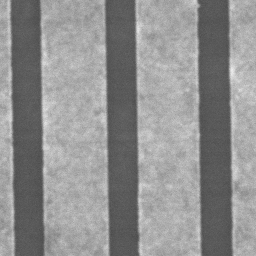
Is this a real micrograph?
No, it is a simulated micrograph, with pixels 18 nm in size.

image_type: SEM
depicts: one or a few lines or trenches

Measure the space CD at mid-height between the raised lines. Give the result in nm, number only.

584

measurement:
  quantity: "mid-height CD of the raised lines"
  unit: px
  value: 61.6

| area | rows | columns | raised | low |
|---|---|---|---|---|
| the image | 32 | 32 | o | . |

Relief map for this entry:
o....oooooooo....oooooooo....ooo
o....oooooooo....ooooooo.....ooo
o....oooooooo....ooooooo.....ooo
o....oooooooo....oooooooo....ooo
o....oooooooo....oooooooo....ooo
o....oooooooo....oooooooo....ooo
o....oooooooo....oooooooo....ooo
o....oooooooo....oooooooo....ooo
o....oooooooo....oooooooo....ooo
o....oooooooo....oooooooo....ooo
o....oooooooo....oooooooo....ooo
o....oooooooo....oooooooo....ooo
o....oooooooo....oooooooo....ooo
o....oooooooo....oooooooo....ooo
o....oooooooo....oooooooo....ooo
o.....ooooooo....oooooooo....ooo
o....oooooooo....oooooooo....ooo
o....oooooooo....oooooooo....ooo
o.....ooooooo....oooooooo....ooo
o.....ooooooo....oooooooo....ooo
o.....ooooooo....oooooooo....ooo
o.....ooooooo....oooooooo....ooo
o.....ooooooo....oooooooo....ooo
o.....ooooooo....oooooooo....ooo
oo....ooooooo.....ooooooo....ooo
oo....ooooooo.....ooooooo....ooo
oo....ooooooo.....ooooooo....ooo
oo....ooooooo.....ooooooo....ooo
oo....ooooooo....oooooooo....ooo
oo....ooooooo.....ooooooo....ooo
oo....ooooooo.....ooooooo....ooo
oo....ooooooo.....ooooooo....ooo